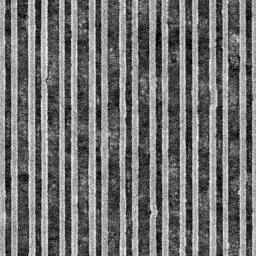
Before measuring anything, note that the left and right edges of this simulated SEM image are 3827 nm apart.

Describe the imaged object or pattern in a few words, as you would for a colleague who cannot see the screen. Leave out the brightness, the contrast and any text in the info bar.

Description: parallel lines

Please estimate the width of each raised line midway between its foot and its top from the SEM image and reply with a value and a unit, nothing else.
80.4 nanometers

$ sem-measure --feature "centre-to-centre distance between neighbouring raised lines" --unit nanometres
228